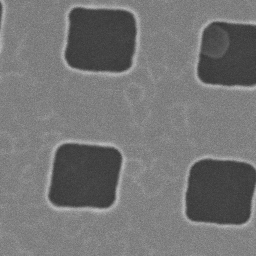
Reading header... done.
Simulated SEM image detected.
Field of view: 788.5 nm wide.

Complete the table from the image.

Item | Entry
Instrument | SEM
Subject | holes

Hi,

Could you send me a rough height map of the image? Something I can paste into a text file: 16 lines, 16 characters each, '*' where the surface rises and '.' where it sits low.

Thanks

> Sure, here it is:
****************
****.....****..*
****.....****...
****....****....
************....
****************
****************
****************
****************
****...*********
***.....****....
***....*****....
***....*****....
************....
****************
****************